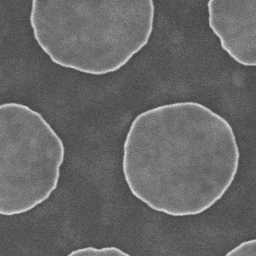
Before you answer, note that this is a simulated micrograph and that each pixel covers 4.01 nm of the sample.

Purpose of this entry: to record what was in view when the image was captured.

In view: raised bodies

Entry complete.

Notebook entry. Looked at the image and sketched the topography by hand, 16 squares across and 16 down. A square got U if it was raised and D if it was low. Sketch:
DDUUUUUUUUDDDUUU
DDUUUUUUUDDDDUUU
DDUUUUUUUDDDDDUU
DDDUUUUUDDDDDDDU
DDDDDDUDDDDDDDDD
DDDDDDDDDDDDDDDD
DDDDDDDDDDDUDDDD
UUUDDDDDDUUUUUDD
UUUUDDDDUUUUUUUD
UUUUDDDDUUUUUUUD
UUUUDDDDUUUUUUUD
UUUDDDDDUUUUUUDD
UUUDDDDDDUUUUDDD
DDDDDDDDDDDDDDDD
DDDDDDDDDDDDDDDD
DDDDDDDDDDDDDDDU